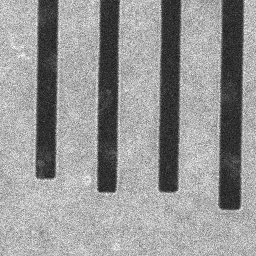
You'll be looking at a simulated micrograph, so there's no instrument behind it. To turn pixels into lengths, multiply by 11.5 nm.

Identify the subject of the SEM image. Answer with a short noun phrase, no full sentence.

one or a few lines or trenches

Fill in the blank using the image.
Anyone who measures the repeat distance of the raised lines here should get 710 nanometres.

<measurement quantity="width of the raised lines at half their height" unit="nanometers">258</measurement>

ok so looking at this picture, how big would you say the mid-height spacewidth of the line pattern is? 444 nm